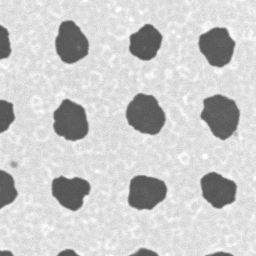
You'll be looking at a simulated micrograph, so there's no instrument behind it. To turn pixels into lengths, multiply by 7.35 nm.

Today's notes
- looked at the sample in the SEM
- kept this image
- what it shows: a regular array of holes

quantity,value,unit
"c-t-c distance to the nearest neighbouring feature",0.527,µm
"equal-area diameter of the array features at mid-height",275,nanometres